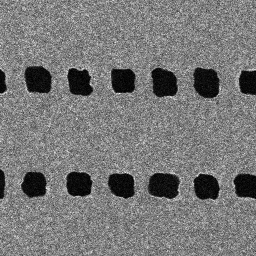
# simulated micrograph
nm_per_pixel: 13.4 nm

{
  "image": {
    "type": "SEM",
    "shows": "a regular array of holes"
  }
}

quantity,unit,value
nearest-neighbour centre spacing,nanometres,556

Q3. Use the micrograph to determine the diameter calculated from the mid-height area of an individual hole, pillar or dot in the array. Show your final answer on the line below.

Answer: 26.5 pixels